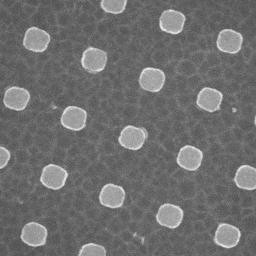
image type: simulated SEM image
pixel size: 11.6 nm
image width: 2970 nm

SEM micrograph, a regular array of raised bodies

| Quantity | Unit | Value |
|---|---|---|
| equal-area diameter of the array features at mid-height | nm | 283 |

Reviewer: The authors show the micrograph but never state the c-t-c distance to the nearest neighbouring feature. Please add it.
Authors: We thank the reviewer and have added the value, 0.706 microns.